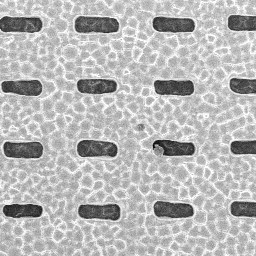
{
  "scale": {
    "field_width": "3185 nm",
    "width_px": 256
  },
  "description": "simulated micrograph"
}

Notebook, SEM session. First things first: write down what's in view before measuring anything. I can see a regular array of holes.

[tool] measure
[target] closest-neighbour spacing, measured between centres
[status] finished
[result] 760 nm